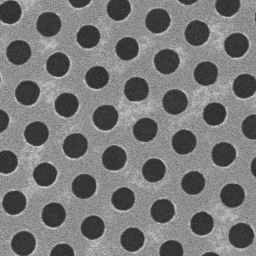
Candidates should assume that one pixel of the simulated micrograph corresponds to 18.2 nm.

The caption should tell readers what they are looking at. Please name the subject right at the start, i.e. a regular array of holes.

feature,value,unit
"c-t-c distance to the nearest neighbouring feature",748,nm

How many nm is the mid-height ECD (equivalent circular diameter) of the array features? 456